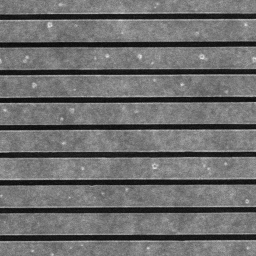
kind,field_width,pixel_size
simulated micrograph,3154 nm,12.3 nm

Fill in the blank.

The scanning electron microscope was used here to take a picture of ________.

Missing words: parallel lines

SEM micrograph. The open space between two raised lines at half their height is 72.4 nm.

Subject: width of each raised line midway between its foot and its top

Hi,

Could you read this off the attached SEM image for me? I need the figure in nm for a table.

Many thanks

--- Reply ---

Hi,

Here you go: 263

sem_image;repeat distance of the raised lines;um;0.34